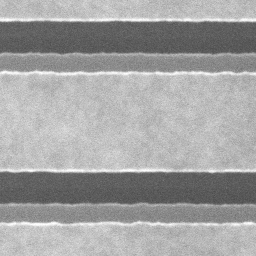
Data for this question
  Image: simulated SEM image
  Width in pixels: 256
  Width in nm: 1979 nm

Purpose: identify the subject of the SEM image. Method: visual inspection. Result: lines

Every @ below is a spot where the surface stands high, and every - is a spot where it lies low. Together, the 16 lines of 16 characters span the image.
@@@@@@@@@@@@@@@@
----------------
----------------
----------------
@-@-------------
@@@@@@@@@@@@@@@@
@@@@@@@@@@@@@@@@
@@@@@@@@@@@@@@@@
@@@@@@@@@@@@@@@@
@@@@@@@@@@@@@@@@
@@@@@@@@@@@@@@@@
----------------
----------------
----------------
@@@@@@@@@@@@@@@@
@@@@@@@@@@@@@@@@